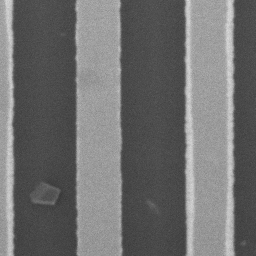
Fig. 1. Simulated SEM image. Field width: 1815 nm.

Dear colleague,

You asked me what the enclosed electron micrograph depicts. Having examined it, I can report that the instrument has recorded lines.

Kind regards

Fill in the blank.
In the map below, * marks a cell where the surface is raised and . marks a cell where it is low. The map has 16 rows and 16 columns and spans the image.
*....**.....**..
*....**.....**..
*....**.....**..
*....**.....**..
*....**.....**..
*....**.....**..
*....**.....**..
*....**.....**..
*....***....**..
*....***....**..
*....***....**..
*....***....**..
*....***....**..
*....***....**..
*....***....**..
*....***....**..